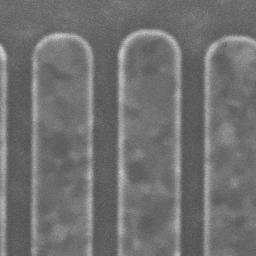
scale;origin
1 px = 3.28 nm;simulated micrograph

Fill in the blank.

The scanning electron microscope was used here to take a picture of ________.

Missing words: one or a few lines or trenches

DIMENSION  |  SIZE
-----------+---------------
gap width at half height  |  0.0952 microns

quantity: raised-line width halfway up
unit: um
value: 0.188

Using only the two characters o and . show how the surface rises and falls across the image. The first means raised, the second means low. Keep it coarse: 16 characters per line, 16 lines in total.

................
................
...oo...ooo...oo
..oooo..ooo..ooo
..oooo..ooo..ooo
..oooo..ooo..ooo
..oooo..ooo..ooo
..oooo..ooo..ooo
..oooo..ooo..ooo
..oooo..ooo..ooo
..oooo..ooo..ooo
..oooo..ooo..ooo
..oooo..ooo..ooo
..oooo..ooo..ooo
..oooo..ooo..ooo
..oooo..ooo..ooo